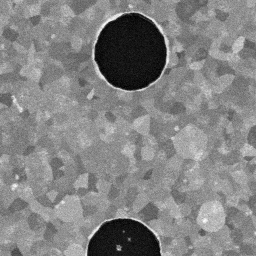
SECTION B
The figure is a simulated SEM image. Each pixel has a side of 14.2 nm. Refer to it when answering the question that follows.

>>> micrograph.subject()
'holes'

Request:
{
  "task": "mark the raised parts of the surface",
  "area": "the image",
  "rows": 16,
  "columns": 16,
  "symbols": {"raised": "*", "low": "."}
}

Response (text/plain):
****************
*******...******
******....******
******....******
******....******
*******..*******
****************
****************
****************
****************
****************
****************
****************
****************
******....******
*****.....******